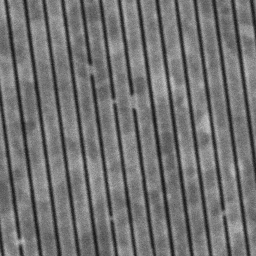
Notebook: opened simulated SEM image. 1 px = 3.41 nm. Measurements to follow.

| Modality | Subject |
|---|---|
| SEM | parallel lines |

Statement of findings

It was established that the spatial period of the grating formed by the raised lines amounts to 0.064 µm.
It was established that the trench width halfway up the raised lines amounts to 15.2 nanometres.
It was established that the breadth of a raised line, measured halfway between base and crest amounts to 49.1 nanometres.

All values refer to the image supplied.